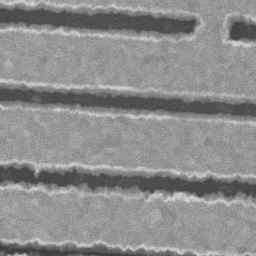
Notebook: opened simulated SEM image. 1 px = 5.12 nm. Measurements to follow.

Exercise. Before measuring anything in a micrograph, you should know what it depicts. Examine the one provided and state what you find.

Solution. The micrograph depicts one or a few lines or trenches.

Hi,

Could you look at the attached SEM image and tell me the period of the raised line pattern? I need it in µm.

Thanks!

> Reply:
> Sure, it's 0.404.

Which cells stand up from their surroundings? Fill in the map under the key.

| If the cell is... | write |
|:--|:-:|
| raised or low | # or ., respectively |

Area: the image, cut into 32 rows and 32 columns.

##.#############################
.................###############
.........................####..#
####.#.#.................####...
###################....######...
################################
################################
################################
################################
################################
.###############################
.................###############
.............................#.#
#########.......................
######################..........
################################
################################
################################
################################
################################
#..#############################
..............##..##############
................................
######.###......................
########################........
################################
################################
################################
################################
################################
..##############################
......................##########